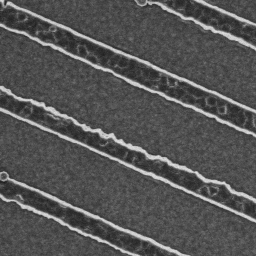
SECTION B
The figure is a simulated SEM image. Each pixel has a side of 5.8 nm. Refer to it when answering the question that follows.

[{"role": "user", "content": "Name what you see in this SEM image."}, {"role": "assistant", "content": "one or a few lines or trenches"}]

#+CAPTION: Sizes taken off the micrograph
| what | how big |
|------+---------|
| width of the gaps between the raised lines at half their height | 340 nanometers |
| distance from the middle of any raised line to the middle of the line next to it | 0.461 µm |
